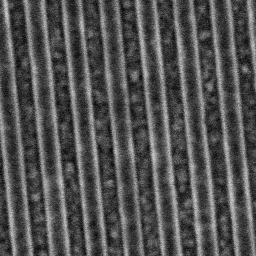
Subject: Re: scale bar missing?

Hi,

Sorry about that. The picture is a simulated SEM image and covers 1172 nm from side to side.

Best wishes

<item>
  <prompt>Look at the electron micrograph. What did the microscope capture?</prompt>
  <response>parallel lines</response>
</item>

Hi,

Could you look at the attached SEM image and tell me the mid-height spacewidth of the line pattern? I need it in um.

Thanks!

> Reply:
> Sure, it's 0.0844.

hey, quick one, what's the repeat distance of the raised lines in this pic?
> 169 nm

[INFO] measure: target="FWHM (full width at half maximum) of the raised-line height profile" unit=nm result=84.4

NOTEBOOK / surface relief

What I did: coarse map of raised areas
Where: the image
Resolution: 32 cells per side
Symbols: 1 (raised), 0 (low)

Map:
10011000110001100110001100111001
10011100110001100111001100011001
10011100110001100111001100011001
10011100110001100111001100011001
10001100110001100111001100011001
10001100111001100011001110011000
10001100111001100011001110011000
11001100111001110011001110011000
11001100011001110011000110011000
11001100011001110011000110011100
11001100011001110011000110011100
11001110011000110011100110001100
11001110011000110011100110001100
11001110011000110011100110001100
11000110011100110001100110001100
11000110011100110001100111001100
11000110011100110001100111001100
11100110001100111001100111001100
11100110001100111001100011001100
11100110001100111001100011001110
01100110001100111001100011001110
01100111001100011001110011000110
01100111001100011001110011000110
01100111001100011001110011000110
01100011001100011000110011000110
01100011001110011000110011100110
01100011001110011000110011100110
01110011000110011100110011100110
01110011000110011100110001100111
01110011000110011100110001100111
00110011000110011100110001100111
00110011100110001100111001100011